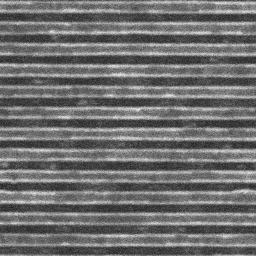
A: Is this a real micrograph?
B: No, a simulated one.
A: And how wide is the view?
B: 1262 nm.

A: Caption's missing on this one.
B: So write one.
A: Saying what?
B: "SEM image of parallel lines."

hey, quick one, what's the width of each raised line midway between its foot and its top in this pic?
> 53 nanometers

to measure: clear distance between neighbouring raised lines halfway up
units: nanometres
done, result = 48.6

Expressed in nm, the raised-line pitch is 104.